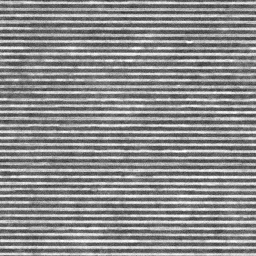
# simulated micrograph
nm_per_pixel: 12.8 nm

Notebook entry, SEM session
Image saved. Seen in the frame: parallel lines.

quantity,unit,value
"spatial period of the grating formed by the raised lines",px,6.44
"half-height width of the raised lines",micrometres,0.0208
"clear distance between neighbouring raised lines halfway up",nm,59.1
